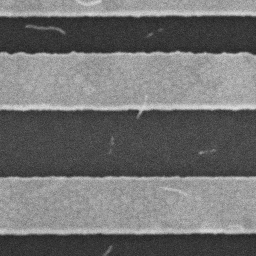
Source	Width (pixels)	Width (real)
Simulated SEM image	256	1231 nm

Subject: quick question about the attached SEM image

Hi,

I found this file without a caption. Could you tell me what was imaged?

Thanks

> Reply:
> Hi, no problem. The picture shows lines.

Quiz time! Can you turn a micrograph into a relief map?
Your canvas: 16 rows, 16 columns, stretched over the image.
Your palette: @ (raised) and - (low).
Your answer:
@@@@@@@@@@@@@@@@
----------------
----------------
@@@@@@@@@@@@@@@@
@@@@@@@@@@@@@@@@
@@@@@@@@@@@@@@@@
@@@@@@@@@@@@@@@@
----------------
----------------
----------------
----------------
@@@@@@@@@@@@@@@@
@@@@@@@@@@@@@@@@
@@@@@@@@@@@@@@@@
@@@@@@@@@@@@@@@@
----------------